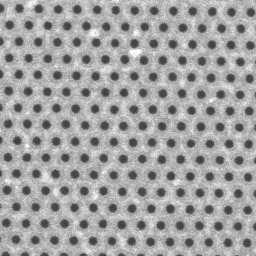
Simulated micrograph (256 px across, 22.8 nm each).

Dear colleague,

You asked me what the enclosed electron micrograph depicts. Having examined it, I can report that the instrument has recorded a regular array of holes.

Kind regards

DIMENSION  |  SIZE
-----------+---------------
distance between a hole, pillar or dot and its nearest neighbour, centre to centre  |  426 nm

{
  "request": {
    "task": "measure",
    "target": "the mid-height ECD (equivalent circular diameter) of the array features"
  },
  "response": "0.22 microns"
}